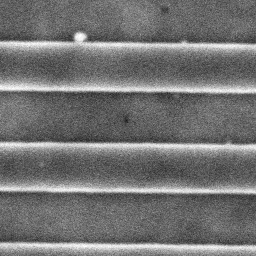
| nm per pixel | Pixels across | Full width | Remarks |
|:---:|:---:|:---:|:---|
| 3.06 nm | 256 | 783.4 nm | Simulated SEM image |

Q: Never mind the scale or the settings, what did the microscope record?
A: wiring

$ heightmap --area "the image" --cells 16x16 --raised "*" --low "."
................
................
................
****************
****************
****************
................
................
................
****************
****************
****************
................
................
................
****************